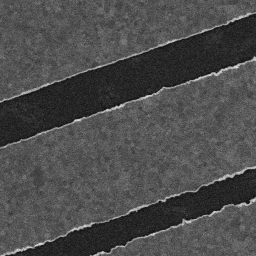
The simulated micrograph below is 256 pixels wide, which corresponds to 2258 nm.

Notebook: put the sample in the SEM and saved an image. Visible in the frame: one or a few lines or trenches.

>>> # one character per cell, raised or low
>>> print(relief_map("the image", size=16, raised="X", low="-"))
XXXXXXXXXXXXXXXX
XXXXXXXXXXXXXX--
XXXXXXXXXXX-----
XXXXXXXX--------
XXXXX---------XX
XXX-------XXXXXX
--------XXXXXXXX
-----XXXXXXXXXXX
--XXXXXXXXXXXXXX
XXXXXXXXXXXXXXXX
XXXXXXXXXXXXXXXX
XXXXXXXXXXXXX---
XXXXXXXXXX------
XXXXXXXX-----XXX
XXXX------XXXXXX
XX-----XXXXXXXXX